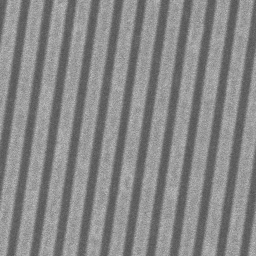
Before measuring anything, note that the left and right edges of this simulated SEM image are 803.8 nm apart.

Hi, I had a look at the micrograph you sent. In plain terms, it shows parallel lines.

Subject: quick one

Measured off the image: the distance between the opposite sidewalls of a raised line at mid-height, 42.3 nm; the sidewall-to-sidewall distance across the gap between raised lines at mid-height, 0.0299 micrometres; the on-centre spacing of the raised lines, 72.3 nm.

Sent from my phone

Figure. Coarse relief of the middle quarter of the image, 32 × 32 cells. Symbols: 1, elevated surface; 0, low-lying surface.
01110001110011110011110011100011
01110001110011110011100011100011
01110011110011100011100011100011
11110011100011100011100011100111
11110011100011100011100011100111
11100011100011100011100111100111
11100011100011100111100111000111
11100011100111100111100111000111
11100111100111100111000111000111
11100111100111000111000111000111
11100111000111000111000111001111
11000111000111000111001111001111
11000111000111000111001111001110
11000111000111001111001110001110
11000111001111001110001110001110
11001111001111001110001110001110
11001111001111001110001110001110
11001110001110001110001110011110
10001110001110001110011110011100
10001110001110011110011110011100
10001110011110011110011100011100
10001110011110011100011100011100
10001110011110011100011100011100
10011100011110011100011100111100
10011100011100011100011100111100
00011100011100011100111100111000
00011100011100111100111000111000
00011100011100111100111000111000
00011100011100111000111000111000
00011100111000111000111000111001
00111000111000111000111001111001
00111000111000111001111001111001